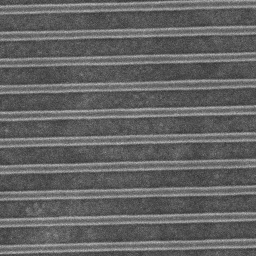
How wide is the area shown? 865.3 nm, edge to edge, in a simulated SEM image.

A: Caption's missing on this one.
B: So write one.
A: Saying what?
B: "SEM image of parallel lines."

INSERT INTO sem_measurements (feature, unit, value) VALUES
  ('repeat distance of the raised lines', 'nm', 89.9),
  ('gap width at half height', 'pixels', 18.7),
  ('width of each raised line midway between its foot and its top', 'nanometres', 25.3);